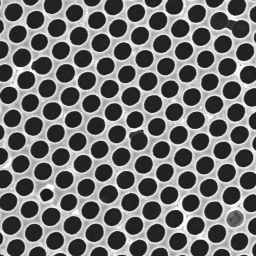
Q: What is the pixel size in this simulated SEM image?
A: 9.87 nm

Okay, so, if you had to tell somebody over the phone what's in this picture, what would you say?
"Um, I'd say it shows a regular array of holes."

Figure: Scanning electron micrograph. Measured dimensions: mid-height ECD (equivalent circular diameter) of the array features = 175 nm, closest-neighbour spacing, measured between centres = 0.224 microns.